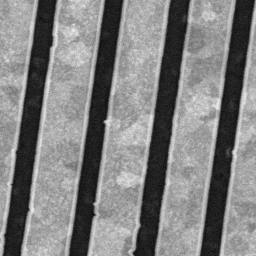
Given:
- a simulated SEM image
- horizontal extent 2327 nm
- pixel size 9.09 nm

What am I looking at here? one or a few lines or trenches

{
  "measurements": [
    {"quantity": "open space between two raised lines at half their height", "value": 0.201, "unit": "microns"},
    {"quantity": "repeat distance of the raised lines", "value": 593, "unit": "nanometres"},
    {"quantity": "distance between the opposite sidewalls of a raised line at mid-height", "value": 386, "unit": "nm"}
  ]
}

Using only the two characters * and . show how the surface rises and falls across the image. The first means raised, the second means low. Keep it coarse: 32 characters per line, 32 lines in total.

*****..******...*****...*****...
****...******..******...*****...
****...******..******...*****...
****...*****...******...*****...
****...*****...*****...******..*
****...*****...*****...*****...*
****...*****...*****...*****...*
***...******...*****...*****...*
***...******..******...*****...*
***...******..******...*****...*
***...*****...******...*****...*
***...*****...*****...******..**
***...*****...*****...*****...**
***..******...*****...*****...**
***..******...*****...*****...**
**...******..******...*****...**
**...******..******...*****...**
**...*****...******...*****...**
**...*****...*****...******..***
**...*****...*****...******..***
**...*****...*****...*****...***
**..******...*****...*****...***
*...******...*****...*****...***
*...******..******...*****...***
*...*****...******...*****...***
*...*****...*****...******..****
*...*****...*****...*****...****
*...*****...*****...*****...****
*..******...*****...*****...****
...******...*****...*****...****
...******..******...*****...****
...*****...******...*****...****